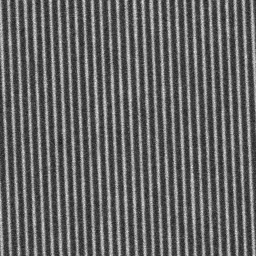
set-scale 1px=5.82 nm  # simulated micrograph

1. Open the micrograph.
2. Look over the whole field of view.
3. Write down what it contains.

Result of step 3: parallel lines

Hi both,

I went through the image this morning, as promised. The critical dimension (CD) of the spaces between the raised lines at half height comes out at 0.0334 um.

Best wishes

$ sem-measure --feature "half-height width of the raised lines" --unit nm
16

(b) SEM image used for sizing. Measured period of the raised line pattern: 48.8 nm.